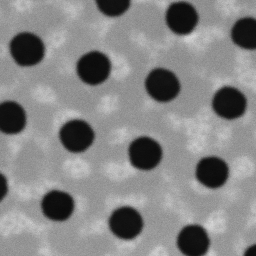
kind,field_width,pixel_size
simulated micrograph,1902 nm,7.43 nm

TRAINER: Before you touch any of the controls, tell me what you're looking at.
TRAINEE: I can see a regular array of holes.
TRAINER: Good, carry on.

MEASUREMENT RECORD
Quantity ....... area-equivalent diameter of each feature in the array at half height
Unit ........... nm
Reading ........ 251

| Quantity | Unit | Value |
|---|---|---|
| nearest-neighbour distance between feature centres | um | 0.518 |